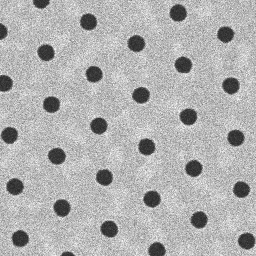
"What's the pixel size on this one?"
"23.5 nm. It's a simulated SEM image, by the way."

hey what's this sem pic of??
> a regular array of holes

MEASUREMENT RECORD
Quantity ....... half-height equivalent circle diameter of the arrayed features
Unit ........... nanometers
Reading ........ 419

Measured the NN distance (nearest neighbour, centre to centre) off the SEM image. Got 1220 nanometers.